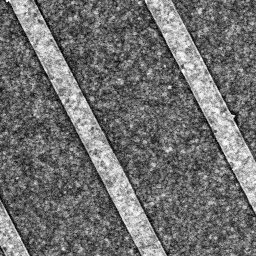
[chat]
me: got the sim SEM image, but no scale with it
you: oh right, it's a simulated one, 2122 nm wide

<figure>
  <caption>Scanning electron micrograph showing one or a few lines or trenches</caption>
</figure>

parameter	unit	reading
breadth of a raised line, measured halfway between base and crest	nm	184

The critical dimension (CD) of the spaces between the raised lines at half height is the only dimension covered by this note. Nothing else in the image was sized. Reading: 817 nm